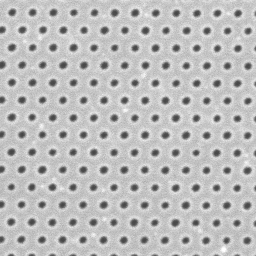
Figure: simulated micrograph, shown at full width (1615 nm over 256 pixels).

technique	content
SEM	a regular array of holes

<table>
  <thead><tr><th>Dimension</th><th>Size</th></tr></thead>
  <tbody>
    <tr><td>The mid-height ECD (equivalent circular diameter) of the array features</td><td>51.9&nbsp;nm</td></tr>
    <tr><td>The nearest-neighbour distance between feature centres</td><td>0.125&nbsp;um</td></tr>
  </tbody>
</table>